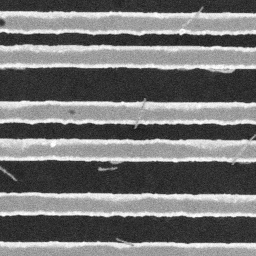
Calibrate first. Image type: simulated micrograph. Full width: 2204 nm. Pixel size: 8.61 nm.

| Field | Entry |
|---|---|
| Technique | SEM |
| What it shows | lines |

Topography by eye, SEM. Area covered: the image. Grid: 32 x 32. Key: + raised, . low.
................................
................................
++++++++++++++++++++++++++++++++
++++++++++++++++++++++++++++++++
................................
................................
++++++++++++++++++++++++++++++++
++++++++++++++++++++++++++++++++
..............................++
................................
................................
................................
................................
++++++++++++++++++++++++++++++++
++++++++++++++++++++++++++++++++
................++..............
................................
................................
++++++++++++++++++++++++++++++++
++++++++++++++++++++++++++++++++
................................
................................
................................
................................
++++++++++++++..++++++++........
++++++++++++++++++++++++++++++++
++++++++++++++++++++++++++++++++
................................
................................
................................
++++++++++++++++++++++....+.....
++++++++++++++++++++++++++++++++